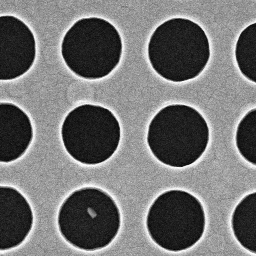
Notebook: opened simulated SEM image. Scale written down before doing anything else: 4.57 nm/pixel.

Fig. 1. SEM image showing holes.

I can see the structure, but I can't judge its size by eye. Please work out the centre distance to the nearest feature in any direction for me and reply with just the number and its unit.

389 nm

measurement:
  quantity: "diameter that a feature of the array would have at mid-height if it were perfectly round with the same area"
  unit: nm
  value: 277